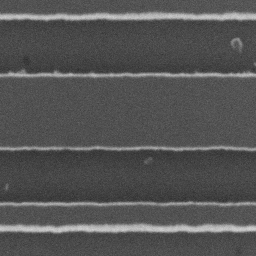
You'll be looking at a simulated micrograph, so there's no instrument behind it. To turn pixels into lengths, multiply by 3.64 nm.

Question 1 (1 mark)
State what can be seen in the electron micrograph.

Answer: lines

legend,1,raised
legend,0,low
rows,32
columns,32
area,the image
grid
11111111111111111111111111111111
11111111111111111111111111111111
00000000000000000000000000000000
00000000000000000000000000000000
00000000000000000000000000000000
00000000000000000000000000000000
00000000000000000000000000000000
00000000000000000000000000000000
00000000000000000000000000000000
11111111111111111111111111111111
11111111111111111111111111111111
11111111111111111111111111111111
11111111111111111111111111111111
11111111111111111111111111111111
11111111111111111111111111111111
11111111111111111111111111111111
11111111111111111111111111111111
11111111111111111111111111111111
11111111111111111111111111111111
00000000000000000000000000000000
00000000000000000000000000000000
00000000000000000000000000000000
00000000000000000000000000000000
00000000000000000000000000000000
00000000000000000000000000000000
11111111111111111111111111111111
11111111111111111111111111111111
11111111111111111111111111111111
11111111111111111111111111111111
00000000000000000000000000000000
00000000000000000000000000000000
00000000000000000000000000000000